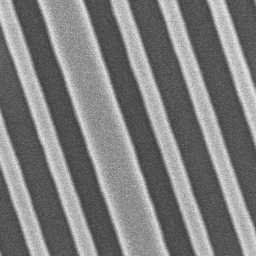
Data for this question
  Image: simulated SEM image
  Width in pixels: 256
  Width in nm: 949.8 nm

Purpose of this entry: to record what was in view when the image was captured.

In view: groups of lines, slits or small figures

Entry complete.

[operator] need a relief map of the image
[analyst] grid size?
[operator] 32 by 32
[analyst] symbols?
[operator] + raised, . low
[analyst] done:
+....++++++...++....++....++....
++...++++++...++....++....++....
++....+++++....++....++....++...
+++...++++++...++....++....++...
.++...++++++...++....++.....++..
.++....+++++....++....++....++..
.+++...++++++...++....++....++..
..++...++++++...++....++....+++.
..++....+++++...+++....++....++.
..+++...++++++...++....++....++.
...++...++++++...++....+++...++.
...++....+++++....++....++....++
...+++...+++++....++....++....++
....++...++++++...++....+++...++
....++....+++++....++....++....+
....+++...++++++...++....++....+
+....++...++++++...++....+++...+
+....++....+++++....++....++....
+....+++...++++++...++....++....
++....++...++++++...++....+++...
++....++....+++++....++....++...
+++...+++...++++++...++....++...
.++....++...++++++...+++...++...
.++....++....+++++....++....++..
.+++...+++...++++++...++....++..
..++....++...++++++...++....+++.
..++....++....+++++....++....++.
...++....++...++++++...++....++.
...++....++...++++++...+++...+++
...++....++....+++++....++....++
...+++...+++...++++++...++....++
....++....++...++++++...+++...++